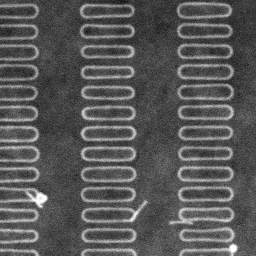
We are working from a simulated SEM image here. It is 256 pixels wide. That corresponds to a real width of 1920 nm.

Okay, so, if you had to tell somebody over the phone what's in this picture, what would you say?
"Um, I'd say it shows groups of lines, slits or small figures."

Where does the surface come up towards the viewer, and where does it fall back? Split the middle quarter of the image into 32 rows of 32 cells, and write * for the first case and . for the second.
..............................**
.....************............***
.....************............***
......*.......................**
................................
..............................**
.....************............***
.....************............***
........*******..............***
................................
................................
.....************............***
.....*************...........***
.....************.............**
................................
................................
.....*************...........***
.....*************...........***
.....************............***
................................
................................
.....************............***
.....*************...........***
.....************............***
................................
................................
.....************............***
.....*************...........***
.....************............***
................................
................................
.....************............***